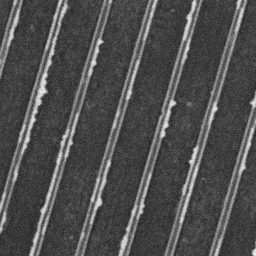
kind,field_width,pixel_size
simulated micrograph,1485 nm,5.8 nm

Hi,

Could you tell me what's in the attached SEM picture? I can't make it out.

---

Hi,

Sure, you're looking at parallel lines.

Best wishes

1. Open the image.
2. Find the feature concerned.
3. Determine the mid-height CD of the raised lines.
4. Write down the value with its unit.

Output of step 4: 43.9 nanometres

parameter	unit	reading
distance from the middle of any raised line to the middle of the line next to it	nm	250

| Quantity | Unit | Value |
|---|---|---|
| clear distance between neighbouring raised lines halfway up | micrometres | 0.207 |